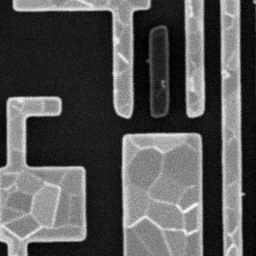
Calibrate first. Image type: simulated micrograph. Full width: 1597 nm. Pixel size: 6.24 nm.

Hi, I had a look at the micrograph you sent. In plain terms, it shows wiring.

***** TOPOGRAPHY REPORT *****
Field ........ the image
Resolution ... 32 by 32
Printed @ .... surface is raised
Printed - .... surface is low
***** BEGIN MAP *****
--@@@@@@@@@@@@@@@@@----@@---@@--
--------------@@@------@@---@@--
--------------@@-------@@---@@--
--------------@@---@@--@@---@@--
--------------@@@--@@--@@---@@--
--------------@@@--@@--@@---@@--
--------------@@@--@@--@@---@@--
--------------@@@--@@--@@---@@--
--------------@@@--@@--@@---@@--
--------------@@---@@--@@---@@--
--------------@@@--@@--@@---@@--
--------------@@@--@@--@@---@@--
-@@@@@@-------@@@--@@--@@---@@--
-@@@@@@@------@@@--@@--@@---@@--
-@@@-----------@---@----@---@@--
-@@-------------------------@@--
-@@-------------------------@@--
-@@------------@@@@@@@@@@---@@--
-@@------------@@@@@@@@@@---@@--
-@@------------@@@@@@@@@@---@@--
-@@------------@@@@@@@@@@---@@--
@@@@@@@@@@@----@@@@@@@@@@---@@--
@@@@@@@@@@@----@@@@@@@@@@---@@--
@@@@@@@@@@@----@@@@@@@@@@---@@--
@@@@@@@@@@@----@@@@@@@@@@---@@--
@@@@@@@@@@@----@@@@@@@@@@---@@--
@@@@@@@@@@@----@@@@@@@@@@---@@--
@@@@@@@@@@@----@@@@@@@@@@---@@--
@@@@@@@@@@@----@@@@@@@@@@---@@--
@@@@@@@@@@@-----@@@@@@@@@---@@--
-@@@------------@@@@@@@@@---@@--
-@@-------------@@@@@@@@@---@@--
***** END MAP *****